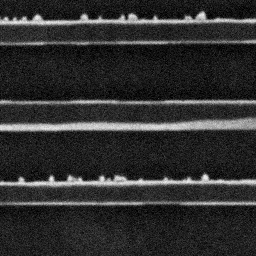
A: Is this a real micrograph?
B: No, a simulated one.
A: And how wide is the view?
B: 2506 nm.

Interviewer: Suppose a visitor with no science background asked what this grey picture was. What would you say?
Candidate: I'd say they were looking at lines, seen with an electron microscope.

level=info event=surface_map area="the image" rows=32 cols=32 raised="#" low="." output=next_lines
................................
................................
....#.....#.....#.......##......
################################
################################
................................
................................
................................
................................
................................
................................
................................
................................
################################
################################
###############################.
................................
................................
................................
................................
................................
................................
.........................#......
################################
################################
................................
................................
................................
................................
................................
................................
................................